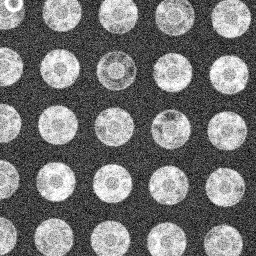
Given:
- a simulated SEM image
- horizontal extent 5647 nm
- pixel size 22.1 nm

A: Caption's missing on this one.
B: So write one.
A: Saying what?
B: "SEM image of an array of small figures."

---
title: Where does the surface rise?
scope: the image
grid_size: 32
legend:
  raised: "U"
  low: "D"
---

DUUUUUDDDDUUUDDDDUUUDDDDUUUDDDUU
DDDUUDDDDDUUUDDDDUUUDDDDUUUDDDDU
DDDUUUDDDDUUUDDDDUUUDDDDUUUDDDDU
DUUUUUUDDUUUUDDDUUUUDDDDUUUDDDDU
UUUUUUUUUUUUUUUUUUUUUUUUUUUUDDUU
UUUUUUUUUUUUUUUUUUUUUUUUUUUUUUUU
DDUUUUUDUUUUUUUUUUUUUUUUUUUUUUUU
DDDUUUDDDUUUUDDDUUUUDDDUUUUDDDUU
DDDUUDDDDDUUDDDDDUUDDDDDUUUDDDDU
DDUUUDDDDDUUDDDDDUUDDDDDUUDDDDDU
DUUUUUDDDUUUUDDDUUUUDDDUUUUDDDUU
UUUUUUUUUUUUUUUUUUUUUUUUUUUUDUUU
UUUUUUUUUUUUUUUUUUUUUUUUUUUUUUUU
DUUUUUDDUUUUUUUUUUUUUUUUUUUUUUUU
DDUUUDDDDUUUDDDDUUUUDDDUUUUDDDUU
DDUUUDDDDDUUDDDDDUUDDDDDUUDDDDDU
DDUUUDDDDUUUDDDDUUUDDDDDUUDDDDDU
DUUUUUDDDUUUUDDDUUUDDDDUUUDDDDUU
UUUUUUUUUUUUUUUUUUUUUUUUUUUUDUUU
UUUUUUUUUUUUUUUUUUUUUUUUUUUUUUUU
DUUUUUDDUUUUUUUUUUUUUUUUUUUUUUUU
DDUUUDDDDUUUDDDDUUUUDDDUUUUDDUUU
DDUUUDDDDUUUDDDDUUUDDDDUUUDDDDUU
DDUUUDDDDUUUDDDDUUUDDDDUUUDDDDUU
DUUUUUDDUUUUDDDDUUUDDDDUUUDDDDUU
UUUUUUUUUUUUUUUUUUUUUUUUUUUDDUUU
UUUUUUUUUUUUUUUUUUUUUUUUUUUUUUUU
DUUUUUDUUUUUUUUUUUUUUUUUUUUUUUUU
DDUUUDDDDUUUDDDUUUUDDDUUUUUDDUUU
DDUUDDDDDUUUDDDDUUUDDDDUUUDDDDUU
DDUUUDDDDUUUDDDDUUUDDDDUUUDDDDUU
DUUUUDDDUUUUDDDDUUUDDDDUUUDDDDUU